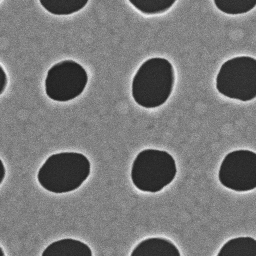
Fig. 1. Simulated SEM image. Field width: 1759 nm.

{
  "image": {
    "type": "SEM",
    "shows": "holes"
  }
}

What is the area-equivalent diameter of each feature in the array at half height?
45.2 px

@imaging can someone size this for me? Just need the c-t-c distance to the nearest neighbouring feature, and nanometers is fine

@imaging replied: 600